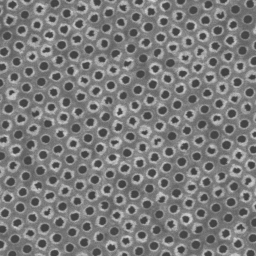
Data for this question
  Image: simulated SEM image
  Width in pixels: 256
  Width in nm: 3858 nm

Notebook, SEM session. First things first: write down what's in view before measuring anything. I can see a regular array of holes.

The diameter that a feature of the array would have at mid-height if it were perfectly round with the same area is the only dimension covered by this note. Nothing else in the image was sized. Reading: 122 nanometers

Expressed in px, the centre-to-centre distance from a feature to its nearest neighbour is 15.4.